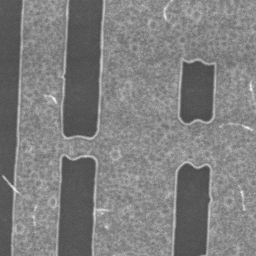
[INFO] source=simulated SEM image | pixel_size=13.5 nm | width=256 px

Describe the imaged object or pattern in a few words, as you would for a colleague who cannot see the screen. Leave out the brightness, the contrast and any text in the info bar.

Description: one or a few lines or trenches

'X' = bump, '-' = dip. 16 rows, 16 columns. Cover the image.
-XXX---XXXXXXXXX
-XXX--XXXXXXXXXX
-XXX--XXXXXXXXXX
-XXX--XXXXXXXXXX
-XXX--XXXXX--XXX
-XXX--XXXXX--XXX
-XXX--XXXXX--XXX
-XXX--XXXXX--XXX
-XXX--XXXXXXXXXX
-XXXXXXXXXXXXXXX
-XXX--XXXXX--XXX
-XXX--XXXXX--XXX
-XXX--XXXXX--XXX
-XXX--XXXXX--XXX
-XXX--XXXXX--XXX
-XXX--XXXXX--XXX